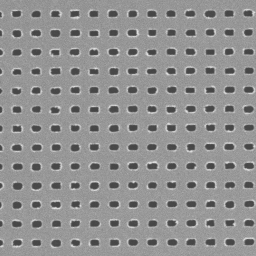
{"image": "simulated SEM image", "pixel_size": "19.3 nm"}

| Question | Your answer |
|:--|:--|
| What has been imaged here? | a regular array of holes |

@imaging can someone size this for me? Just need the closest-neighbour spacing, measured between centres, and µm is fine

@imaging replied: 0.363